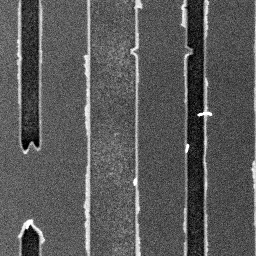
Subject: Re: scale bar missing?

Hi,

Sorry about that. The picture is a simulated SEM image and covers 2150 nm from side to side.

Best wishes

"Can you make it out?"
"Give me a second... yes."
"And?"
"one or a few lines or trenches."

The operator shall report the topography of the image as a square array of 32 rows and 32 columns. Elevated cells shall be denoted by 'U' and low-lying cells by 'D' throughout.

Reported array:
UUUDDUUUUUUDDDDDDUUUUUUDDDUUUUUU
UUUDDUUUUUUDDDDDDUUUUUUDDDUUUUUU
UUUDDUUUUUUDDDDDDUUUUUUDDDUUUUUU
UUUDDUUUUUUDDDDDDUUUUUUDDDUUUUUU
UUUDDUUUUUUDDDDDDUUUUUUDDDUUUUUU
UUUDDUUUUUUDDDDDDUUUUUUDDDUUUUUU
UUUDDUUUUUUDDDDDUUUUUUUUDDUUUUUU
UUUDDUUUUUUDDDDDDUUUUUUDDDUUUUUU
UUUDDUUUUUUDDDDDDUUUUUUDDDUUUUUU
UUUDDUUUUUUDDDDDDUUUUUUDDDUUUUUU
UUUDDUUUUUUDDDDDDUUUUUUDDDUUUUUU
UUUDDUUUUUUDDDDDDUUUUUUDDDUUUUUU
UUUDDUUUUUUDDDDDDUUUUUUDDDUUUUUU
UUUDDUUUUUUDDDDDDUUUUUUDDDUUUUUU
UUUDDUUUUUUDDDDDDUUUUUUDDUUUUUUU
UUUDDUUUUUUDDDDDDUUUUUUDDDUUUUUU
UUUDDUUUUUUDDDDDDUUUUUUDDDUUUUUU
UUUDDUUUUUUDDDDDDUUUUUUDDDUUUUUU
UUUUUUUUUUUDDDDDDUUUUUUDDDUUUUUU
UUUUUUUUUUUDDDDDDUUUUUUDDUUUUUUU
UUUUUUUUUUUDDDDDDUUUUUUDDUUUUUUU
UUUUUUUUUUUDDDDDDUUUUUUDDDUUUUUU
UUUUUUUUUUUDDDDDDUUUUUUDDDUUUUUU
UUUUUUUUUUUDDDDDDUUUUUUDDDUUUUUU
UUUUUUUUUUUDDDDDDUUUUUUDDDUUUUUU
UUUUUUUUUUUDDDDDDUUUUUUDDDUUUUUU
UUUUUUUUUUUDDDDDDUUUUUUDDDUUUUUU
UUUUUUUUUUUDDDDDDUUUUUUDDDUUUUUU
UUUDUUUUUUUDDDDDDUUUUUUDDDUUUUUU
UUUDDUUUUUUDDDDDDUUUUUUDDDUUUUUU
UUUDDUUUUUUDDDDDDUUUUUUDDDUUUUUU
UUUDDUUUUUUDDDDDDUUUUUUDDDUUUUUU